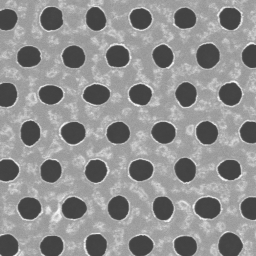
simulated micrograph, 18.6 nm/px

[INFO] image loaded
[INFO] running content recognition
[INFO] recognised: a regular array of holes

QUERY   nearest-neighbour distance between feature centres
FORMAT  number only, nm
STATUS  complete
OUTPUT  808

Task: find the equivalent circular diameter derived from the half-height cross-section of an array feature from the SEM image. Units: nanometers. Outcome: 424